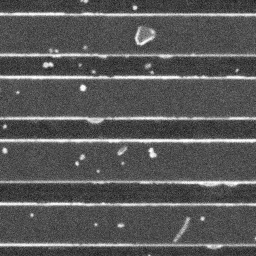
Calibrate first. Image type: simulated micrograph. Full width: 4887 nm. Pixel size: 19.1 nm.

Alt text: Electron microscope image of lines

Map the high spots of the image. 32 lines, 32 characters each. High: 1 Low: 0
00000000000000000000000000000000
00000000000000000000000000000000
11111111111111111111111111111111
11111111111111111111111111111111
11111111111111111111111111111111
11111111111111111111111111111111
11111111111111111111111111111111
00000000000000000000000000000000
00000000000000000000000000000000
00000000000000000000000000000000
11111111111111111111111111111111
11111111111111111111111111111111
11111111111111111111111111111111
11111111111111111111111111111111
11111111111111111111111111111111
00000000000000000000000000000000
00000000000000000000000000000000
00000000000000000000000000000000
11111111111111111111111111111111
11111111111111111111111111111111
11111111111111111111111111111111
11111111111111111111111111111111
11111111111111111111111111111111
00000000000000000000000000000000
00000000000000000000000000000000
00000000000000000000000000000000
11111111111111111111111111111111
11111111111111111111111111111111
11111111111111111111111111111111
11111111111111111111111111111111
11111111111111111111111111111111
00000000000000000000000000000000